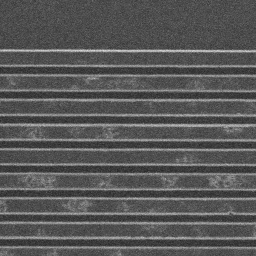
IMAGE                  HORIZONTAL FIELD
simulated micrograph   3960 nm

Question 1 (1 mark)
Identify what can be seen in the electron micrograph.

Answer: parallel lines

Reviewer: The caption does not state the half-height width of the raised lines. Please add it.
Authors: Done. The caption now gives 248 nanometers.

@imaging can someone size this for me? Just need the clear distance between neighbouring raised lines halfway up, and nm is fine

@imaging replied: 137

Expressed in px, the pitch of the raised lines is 24.6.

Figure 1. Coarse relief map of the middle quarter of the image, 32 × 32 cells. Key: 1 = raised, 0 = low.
01000000111111000111110000011111
00000000000000000000000000000000
00000000000000000000000000000000
11111111111111111111111111111111
11111111111111111111111111111111
11111111111111111111111111111111
11111111111111111111111111111111
00000000000000000000000000000000
00000000000000000000000000000000
11111111111111111111111111111111
11111111111111111111111111111111
11111111111111111111111111111111
11111111111111111111111111111111
00000000000000000000000000000000
00000000000000000000000000000000
11111111111111111111111111111111
11111111111111111111111111111111
11111111111111111111111111111111
11111111111111111111111111111111
00000000000000000000000000000000
00000000000000000000000000000000
11111100000000011111111110001111
11111111111111111111111111111111
11111111111111111111111111111111
11111111111111111111111111111111
00000000000000000000000000000000
00000000000000000000000000000000
11111100000000000000000000000000
11111111111111111111111111111111
11111111111111111111111111111111
11111111111111111111111111111111
00000000000000000000000000000000